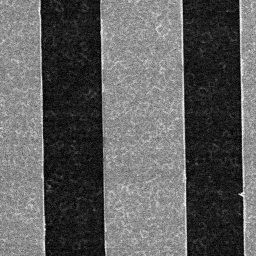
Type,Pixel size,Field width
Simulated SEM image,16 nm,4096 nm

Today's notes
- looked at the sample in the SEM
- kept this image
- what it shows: one or a few lines or trenches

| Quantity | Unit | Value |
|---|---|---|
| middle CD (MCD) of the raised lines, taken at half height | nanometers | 1290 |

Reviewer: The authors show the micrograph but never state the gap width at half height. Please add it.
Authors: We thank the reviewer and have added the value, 954 nanometers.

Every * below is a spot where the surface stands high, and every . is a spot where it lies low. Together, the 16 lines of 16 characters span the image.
***...*****....*
***...*****....*
***...*****....*
***...*****....*
***...*****....*
***...*****....*
***...*****....*
***...*****....*
***...*****....*
***....*****...*
***....*****...*
***....*****...*
***....*****...*
***....*****...*
***....*****...*
***....*****...*